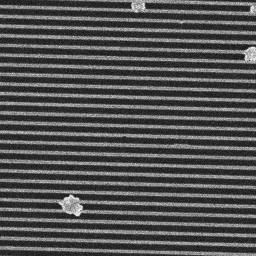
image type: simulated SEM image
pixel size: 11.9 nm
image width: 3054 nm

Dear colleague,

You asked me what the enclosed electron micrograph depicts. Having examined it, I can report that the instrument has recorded parallel lines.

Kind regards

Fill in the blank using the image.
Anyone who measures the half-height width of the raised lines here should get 44.7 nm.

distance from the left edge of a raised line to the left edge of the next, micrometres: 0.115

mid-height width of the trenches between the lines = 77.5 nm